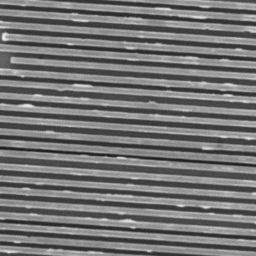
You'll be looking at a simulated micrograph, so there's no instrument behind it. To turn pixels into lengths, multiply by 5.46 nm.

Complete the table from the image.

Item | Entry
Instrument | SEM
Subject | parallel lines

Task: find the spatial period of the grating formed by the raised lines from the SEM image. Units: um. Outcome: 0.0645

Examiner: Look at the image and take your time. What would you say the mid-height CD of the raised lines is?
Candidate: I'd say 35.4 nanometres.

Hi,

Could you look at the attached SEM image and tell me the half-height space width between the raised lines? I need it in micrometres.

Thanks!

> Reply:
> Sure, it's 0.0299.